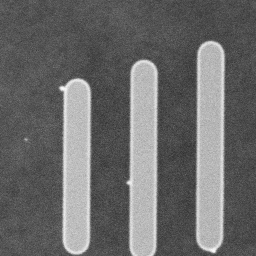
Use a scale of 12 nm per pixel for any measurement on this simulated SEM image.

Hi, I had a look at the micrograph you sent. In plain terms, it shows groups of lines, slits or small figures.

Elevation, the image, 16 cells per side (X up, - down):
----------------
----------------
----------------
------------XX--
--------XX--XX--
----XX--XX--XX--
----XX--XX--XX--
----XX--XX--XX--
----XX--XX--XX--
----XX--XX--XX--
----XX--XX--XX--
----XX--XX--XX--
----XX--XX--XX--
----XX--XX--XX--
----XX--XX--XX--
----X---XX------